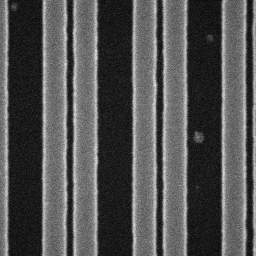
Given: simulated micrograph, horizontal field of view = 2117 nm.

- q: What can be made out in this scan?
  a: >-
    lines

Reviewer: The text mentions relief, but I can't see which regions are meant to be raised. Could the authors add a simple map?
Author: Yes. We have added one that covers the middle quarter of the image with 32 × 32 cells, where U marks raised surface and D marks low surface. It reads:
UDDUUUUUDDDDDDDDDUUUUUUDDUUUUUDD
DDDUUUUUDDDDDDDDDUUUUUUDDUUUUUDD
DDDUUUUUDDDDDDDDDDUUUUUDDUUUUUUD
DDDUUUUUDDDDDDDDDUUUUUUDDUUUUUDD
DDDUUUUUDDDDDDDDDUUUUUUDDUUUUUDD
DDDUUUUUDDDDDDDDDDUUUUUDDUUUUUUD
DDDUUUUUDDDDDDDDDDUUUUUDDUUUUUUD
DDDUUUUUDDDDDDDDDDUUUUUDDUUUUUUD
DDDUUUUUDDDDDDDDDDUUUUUDDUUUUUUD
UDDUUUUUDDDDDDDDDDUUUUUDDUUUUUUD
UDDUUUUUDDDDDDDDDDUUUUUDDUUUUUUD
UDDUUUUUDDDDDDDDDDUUUUUDDUUUUUUD
DDDUUUUUDDDDDDDDDDUUUUUDDUUUUUDD
DDDUUUUUDDDDDDDDDDUUUUUDDUUUUUUD
DDDUUUUUDDDDDDDDDDUUUUUDDUUUUUUD
DDDUUUUUDDDDDDDDDDUUUUUDDUUUUUDD
DDDUUUUUDDDDDDDDDDUUUUUDDUUUUUDD
DDDUUUUUDDDDDDDDDDUUUUUDDUUUUUDD
DDDUUUUUDDDDDDDDDDUUUUUDDUUUUUUD
UDDUUUUUDDDDDDDDDDUUUUUDDUUUUUDD
UDDUUUUUDDDDDDDDDDUUUUUDDUUUUUDD
DDDUUUUUDDDDDDDDDDUUUUUDDUUUUUUD
DDDUUUUUDDDDDDDDDDUUUUUDDUUUUUUD
DDDUUUUUDDDDDDDDDDUUUUUDDUUUUUUD
DDDUUUUUDDDDDDDDDDUUUUUDDUUUUUDD
DDDUUUUUDDDDDDDDDUUUUUUDDUUUUUDD
DDDUUUUUDDDDDDDDDDUUUUUDDUUUUUDD
DDDUUUUUDDDDDDDDDDUUUUUDDUUUUUDD
DDDUUUUUDDDDDDDDDDUUUUUDDUUUUUDD
UDDUUUUUDDDDDDDDDUUUUUUDDUUUUUDD
UDDUUUUUDDDDDDDDDUUUUUUDDUUUUUDD
DDDUUUUUDDDDDDDDDDUUUUUDDUUUUUDD